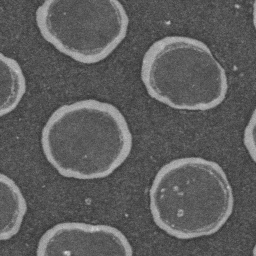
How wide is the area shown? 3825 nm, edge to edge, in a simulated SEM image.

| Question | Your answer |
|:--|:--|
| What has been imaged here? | raised bodies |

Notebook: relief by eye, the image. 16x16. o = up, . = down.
...oooo.........
...ooooo........
...oooo...oo....
.....o...oooo...
o........ooooo..
o........ooooo..
o....o.....oo...
...ooooo........
...ooooo........
...ooooo........
....ooo...oooo..
o.........oooo..
o.........oooo..
o.........oooo..
o..oooo....oo...
...ooooo........